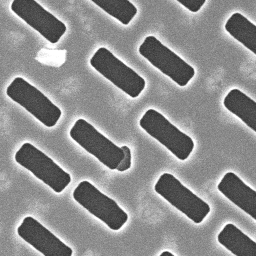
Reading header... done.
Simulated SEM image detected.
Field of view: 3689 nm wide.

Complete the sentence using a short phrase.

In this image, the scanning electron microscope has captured a regular array of holes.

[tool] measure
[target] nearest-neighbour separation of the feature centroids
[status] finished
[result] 872 nm